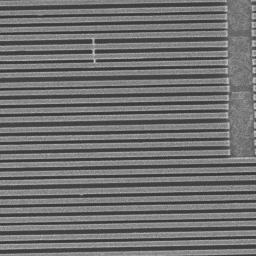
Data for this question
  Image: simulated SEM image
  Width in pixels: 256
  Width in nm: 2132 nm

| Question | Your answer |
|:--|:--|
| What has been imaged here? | parallel lines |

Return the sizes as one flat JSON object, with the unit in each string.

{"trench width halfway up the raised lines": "28.1 nanometers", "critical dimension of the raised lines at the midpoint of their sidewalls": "50 nm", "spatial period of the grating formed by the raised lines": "0.075 um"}